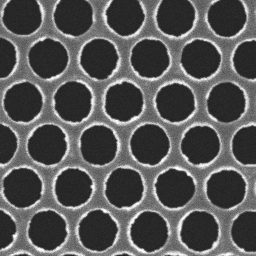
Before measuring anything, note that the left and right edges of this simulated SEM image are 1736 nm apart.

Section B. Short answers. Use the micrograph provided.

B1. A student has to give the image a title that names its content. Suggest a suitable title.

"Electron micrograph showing a regular array of holes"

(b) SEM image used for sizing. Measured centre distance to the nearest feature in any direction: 336 nm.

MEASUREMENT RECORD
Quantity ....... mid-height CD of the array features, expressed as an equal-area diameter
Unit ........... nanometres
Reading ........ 265